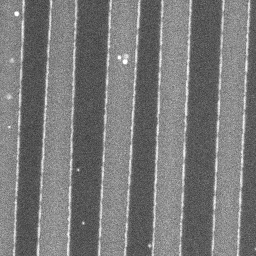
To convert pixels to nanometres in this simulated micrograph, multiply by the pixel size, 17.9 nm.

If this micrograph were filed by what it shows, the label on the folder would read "lines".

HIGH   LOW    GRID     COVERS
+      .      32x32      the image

...+++...+++++...+++....++++...+
...+++...+++++...+++....++++...+
...+++...+++++...+++....++++...+
...+++...+++++...+++....++++...+
...+++...+++++...+++....++++...+
...+++...+++++...+++....++++...+
...+++...+++++...+++....++++...+
...+++...+++++...+++...+++++...+
...+++...++++....+++...+++++...+
...+++...++++....+++...++++....+
...+++...++++....+++...++++....+
..++++...++++....+++...++++....+
..++++...++++....+++...++++....+
..++++...++++....+++...++++....+
..++++...++++....+++...++++...++
..++++...++++...++++...++++...++
..++++...++++...++++...++++...++
..++++...++++...++++...++++...++
..+++....++++...++++...++++...++
..+++....++++...++++...++++...++
..+++....++++...++++...++++...++
..+++....++++...++++...++++...++
..+++....++++...++++...++++...++
..+++....++++...+++....++++...++
..+++....++++...+++....++++...++
..+++....++++...+++....++++...++
..+++....++++...+++....++++...++
..+++....++++...+++....++++...++
..+++....++++...+++....++++...++
..+++....++++...+++....++++...++
..+++....+++....+++...+++++...++
..+++....+++....+++...+++++...++